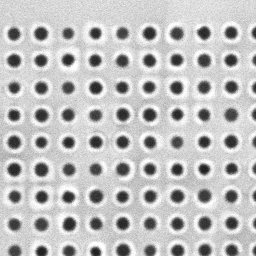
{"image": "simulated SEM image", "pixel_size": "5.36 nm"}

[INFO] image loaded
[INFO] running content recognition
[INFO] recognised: a regular array of holes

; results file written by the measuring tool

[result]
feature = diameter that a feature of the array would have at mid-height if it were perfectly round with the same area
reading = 70.9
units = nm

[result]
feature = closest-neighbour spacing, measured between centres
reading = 144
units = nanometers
